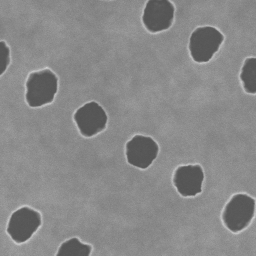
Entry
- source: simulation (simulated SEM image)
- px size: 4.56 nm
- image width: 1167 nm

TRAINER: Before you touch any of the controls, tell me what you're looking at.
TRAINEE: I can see holes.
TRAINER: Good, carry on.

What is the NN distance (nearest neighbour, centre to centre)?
266 nm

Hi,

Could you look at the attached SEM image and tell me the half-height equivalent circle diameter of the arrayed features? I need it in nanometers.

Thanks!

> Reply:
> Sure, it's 146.